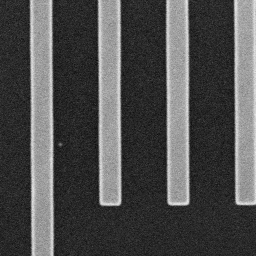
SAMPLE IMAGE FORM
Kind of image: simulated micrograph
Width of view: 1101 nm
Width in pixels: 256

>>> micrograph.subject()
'groups of lines, slits or small figures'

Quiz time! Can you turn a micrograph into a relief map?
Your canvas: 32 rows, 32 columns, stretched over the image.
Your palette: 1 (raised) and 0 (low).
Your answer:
00001100000011100000011000000111
00001100000011100000011000000111
00001100000011100000011000000111
00001100000011100000011000000111
00001100000011100000011100000111
00001100000011100000011100000111
00001100000011100000011100000111
00001100000011100000011100000111
00001110000011100000011100000111
00001110000011100000011100000111
00001110000011100000011100000111
00001110000011100000011100000111
00001110000011100000011100000111
00001110000011100000011100000111
00001110000011100000011100000111
00001110000011100000011100000111
00001110000011100000011100000011
00001110000011100000011100000111
00001110000011100000011100000111
00001110000001100000011100000111
00001110000001100000011100000111
00001110000001100000011100000011
00001110000001100000011100000011
00001110000001100000011100000011
00001110000001100000011100000011
00001110000001100000011000000011
00001110000000000000000000000000
00001110000000000000000000000000
00001110000000000000000000000000
00001110000000000000000000000000
00001110000000000000000000000000
00001110000000000000000000000000